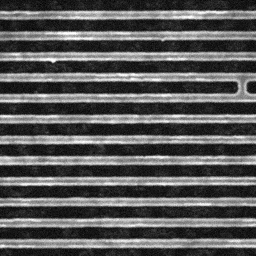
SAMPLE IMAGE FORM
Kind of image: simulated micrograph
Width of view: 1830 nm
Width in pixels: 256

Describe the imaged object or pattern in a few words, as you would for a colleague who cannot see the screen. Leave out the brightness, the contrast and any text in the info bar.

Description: parallel lines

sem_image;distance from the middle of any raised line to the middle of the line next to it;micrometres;0.149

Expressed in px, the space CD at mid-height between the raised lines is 14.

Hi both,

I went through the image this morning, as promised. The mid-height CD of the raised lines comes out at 46.5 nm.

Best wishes